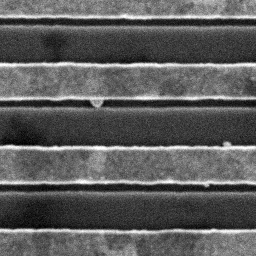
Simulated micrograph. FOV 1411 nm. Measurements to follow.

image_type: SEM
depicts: lines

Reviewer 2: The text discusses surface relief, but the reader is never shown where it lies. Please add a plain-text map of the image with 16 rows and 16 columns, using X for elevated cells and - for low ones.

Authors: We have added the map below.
XXXXXXXXXXXXXXXX
----------------
----------------
----------------
XXXXXXXXXXXXXXXX
XXXXXXXXXXXXXXXX
----------------
----------------
----------------
XXXXXXXXXXXXXXXX
XXXXXXXXXXXXXXXX
----------------
----------------
----------------
XXXXXXXXXXXXXXXX
XXXXXXXXXXXXXXXX